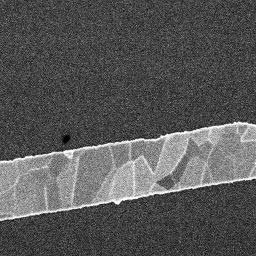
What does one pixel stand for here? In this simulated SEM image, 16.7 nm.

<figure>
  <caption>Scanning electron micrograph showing one or a few lines or trenches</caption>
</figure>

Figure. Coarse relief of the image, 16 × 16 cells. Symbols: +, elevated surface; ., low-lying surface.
................
................
................
................
................
................
................
................
..........++++++
....++++++++++++
++++++++++++++++
++++++++++++++..
++++++++........
++..............
................
................